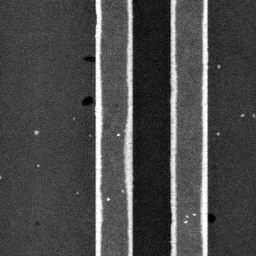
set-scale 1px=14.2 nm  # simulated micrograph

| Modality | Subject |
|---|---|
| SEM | lines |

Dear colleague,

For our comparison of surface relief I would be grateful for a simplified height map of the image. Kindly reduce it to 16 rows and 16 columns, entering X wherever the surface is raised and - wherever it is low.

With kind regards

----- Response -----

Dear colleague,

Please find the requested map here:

------XX---XX---
------XX---XX---
------XX---XX---
------XX---XX---
------XX---XX---
------XX---XX---
------XX---XX---
------XX---XX---
------XX---XX---
------XX---XX---
------XX---XX---
------XX---XX---
------XX---XX---
------XX---XX---
------XX---XX---
------XX---XX---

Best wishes